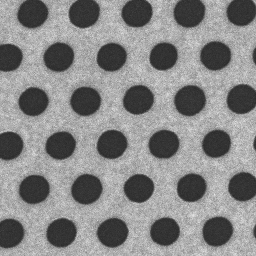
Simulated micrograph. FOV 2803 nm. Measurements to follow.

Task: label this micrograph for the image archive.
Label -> a regular array of holes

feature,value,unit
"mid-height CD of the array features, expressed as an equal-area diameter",326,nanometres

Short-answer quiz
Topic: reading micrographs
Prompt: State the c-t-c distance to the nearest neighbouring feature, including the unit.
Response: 554 nm